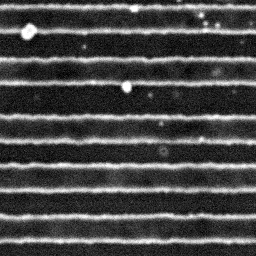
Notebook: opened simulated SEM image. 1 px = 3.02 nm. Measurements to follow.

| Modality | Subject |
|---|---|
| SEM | lines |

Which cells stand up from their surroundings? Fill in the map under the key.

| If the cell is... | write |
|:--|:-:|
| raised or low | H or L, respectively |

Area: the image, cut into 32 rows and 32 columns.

LLLLLLLLLLLLLLLLLLLLLLLLLLLLLLLL
HHHHHHHHHHHHHHHHHHHHHHHHHHHHHHHH
HHHHHHHHHHHHHHHHHHHHHHHHHHHHHHHH
HHHHHHHHHHHHHHHHHHHHHHHHHHHHHHHH
LLLHLLLLLLLLLLLLLLLLLLLLLLLLLLLL
LLLLLLLLLLLLLLLLLLLLLLLLLLLLLLLL
LLLLLLLLLLLLLLLLLLLLLLLLLLLLLLLL
HHHHHHHHHHHHHHHHHHHHHHHHHHHHHHHH
HHHHHHHHHHHHHHHHHHHHHHHHHHHHHHHH
HHHHHHHHHHHHHHHHHHHHHHHHHHHHHHHH
HHHHHHHHHHHLLLHHHLHHHHHHHHHHHHHH
LLLLLLLLLLLLLLLLLLLLLLLLLLLLLLLL
LLLLLLLLLLLLLLLLLLLLLLLLLLLLLLLL
LLLLLLLLLLLLLLLLLLLLLLLLLLLLLLLL
HHHHHHHLLHHHHHLHHHHHHLHLLHLHLHLL
HHHHHHHHHHHHHHHHHHHHHHHHHHHHHHHH
HHHHHHHHHHHHHHHHHHHHHHHHHHHHHHHH
HHHHHHHHHHHHHHHHHHHHHHHHHHHHHHHH
LLLLLLLLLLLLLLLLLLLLLLLLLLLLLLLL
LLLLLLLLLLLLLLLLLLLLLLLLLLLLLLLL
LHLLHLLLLLLLLLLLLLLLLLLLLLLLLLLL
HHHHHHHHHHHHHHHHHHHHHHHHHHHHHHHH
HHHHHHHHHHHHHHHHHHHHHHHHHHHHHHHH
HHHHHHHHHHHHHHHHHHHHHHHHHHHHHHHH
LLLLLLLLLLLLLLLLLLLLLLLLLLLLLLLL
LLLLLLLLLLLLLLLLLLLLLLLLLLLLLLLL
LLLLLLLLLLLLLLLLLLLLLLLLLLLLLLLL
HHHHHHHHHHHHHHHHHHHHHHHHHHHHHHHH
HHHHHHHHHHHHHHHHHHHHHHHHHHHHHHHH
HHHHHHHHHHHHHHHHHHHHHHHHHHHHHHHH
LLLLLLLLLLLLLLLLLLLLLLLLLLLLLLLL
LLLLLLLLLLLLLLLLLLLLLLLLLLLLLLLL